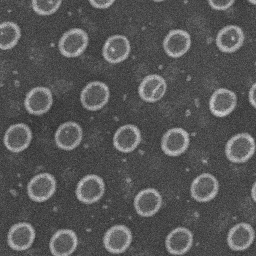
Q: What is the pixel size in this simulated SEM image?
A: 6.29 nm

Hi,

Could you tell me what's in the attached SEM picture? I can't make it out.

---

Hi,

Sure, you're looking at a regular array of raised bodies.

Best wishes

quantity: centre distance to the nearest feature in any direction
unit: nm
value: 307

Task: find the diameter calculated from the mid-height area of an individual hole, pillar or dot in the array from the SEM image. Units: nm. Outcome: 162